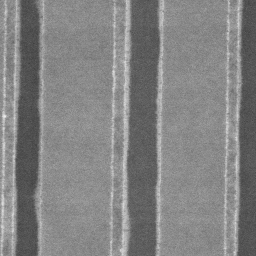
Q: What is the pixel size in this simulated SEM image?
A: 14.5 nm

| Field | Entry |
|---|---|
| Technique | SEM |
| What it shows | lines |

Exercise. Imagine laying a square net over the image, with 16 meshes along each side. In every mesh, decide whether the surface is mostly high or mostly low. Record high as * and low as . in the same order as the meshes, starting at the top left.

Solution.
*..*****..*****.
*..*****..*****.
*..*****..*****.
*..*****..*****.
*..*****..*****.
*..*****..*****.
*..*****..*****.
*..*****..*****.
*..*****..*****.
*..*****..*****.
*..*****..*****.
*..*****..*****.
*.******..*****.
*.******..*****.
*.******..*****.
*..*****..*****.